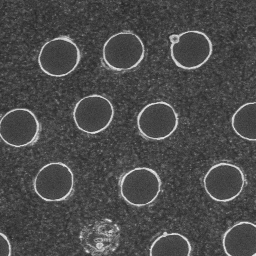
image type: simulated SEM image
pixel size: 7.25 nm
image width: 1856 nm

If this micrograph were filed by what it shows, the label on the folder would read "a regular array of holes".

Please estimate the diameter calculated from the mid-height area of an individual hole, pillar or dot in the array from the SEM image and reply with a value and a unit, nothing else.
266 nm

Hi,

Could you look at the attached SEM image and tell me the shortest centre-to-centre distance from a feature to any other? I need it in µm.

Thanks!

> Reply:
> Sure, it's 0.481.